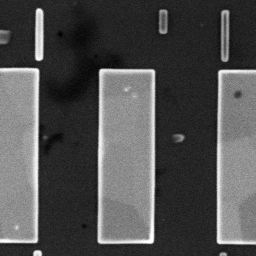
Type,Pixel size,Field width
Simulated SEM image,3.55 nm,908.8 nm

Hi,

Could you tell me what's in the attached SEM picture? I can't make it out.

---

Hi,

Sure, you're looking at wiring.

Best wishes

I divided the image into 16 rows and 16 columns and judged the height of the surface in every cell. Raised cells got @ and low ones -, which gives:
----------------
----------------
----------------
----------------
@@----@@@-----@@
@@----@@@@----@@
@@----@@@@----@@
@@----@@@@----@@
@@----@@@@----@@
@@----@@@@----@@
@@----@@@@----@@
@@----@@@@----@@
@@----@@@@----@@
@@----@@@@----@@
@@----@@@-----@@
----------------